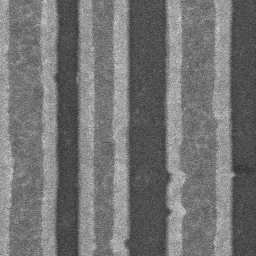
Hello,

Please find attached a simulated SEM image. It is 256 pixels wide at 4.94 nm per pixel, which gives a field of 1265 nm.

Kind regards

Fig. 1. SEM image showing one or a few lines or trenches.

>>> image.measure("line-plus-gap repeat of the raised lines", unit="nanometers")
449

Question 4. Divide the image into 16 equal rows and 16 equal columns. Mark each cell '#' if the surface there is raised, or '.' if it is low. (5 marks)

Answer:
###..###...###..
###..###...###..
###..###...###..
###..###...###..
###..###...###..
###..###...###..
###..###...###..
###..###...###..
###..###...###..
###..###...###..
###..###...###..
###..###...###..
###..###...###..
###..###...###..
###..###...###..
###..##....###..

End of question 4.